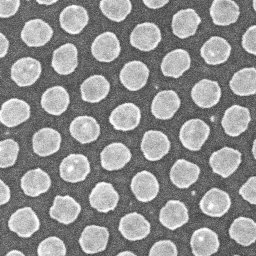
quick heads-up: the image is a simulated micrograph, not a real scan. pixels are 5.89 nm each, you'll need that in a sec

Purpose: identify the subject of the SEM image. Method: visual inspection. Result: a regular array of raised bodies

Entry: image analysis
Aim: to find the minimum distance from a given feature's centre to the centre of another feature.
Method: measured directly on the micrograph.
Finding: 238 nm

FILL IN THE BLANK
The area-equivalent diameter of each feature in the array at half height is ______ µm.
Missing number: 0.164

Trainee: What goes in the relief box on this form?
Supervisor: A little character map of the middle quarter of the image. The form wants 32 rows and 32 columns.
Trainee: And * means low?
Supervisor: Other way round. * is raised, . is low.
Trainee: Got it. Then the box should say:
***............*****....*******.
**.............******....*****..
*.............*******....****...
.......***....*******...........
.....******....*****............
....*******....*****............
....*******.....................
*....******.............****....
*....*****.............******...
*.....................*******...
*.............****....*******...
.............*****....******....
............*******...*****.....
...****.....*******.....**......
..******....*******............*
..*******....*****............**
..*******....................***
..*******...........*****....***
...*****............*****....***
....**..............******....**
...........****....*******....**
..........******....******......
.........*******....*****.......
.****....*******.....***........
******....******............***.
******....*****............*****
******.....*...............*****
******.............***.....*****
*****............******....*****
.................******....*****
........****.....******.....***.
.......*****.....******.........